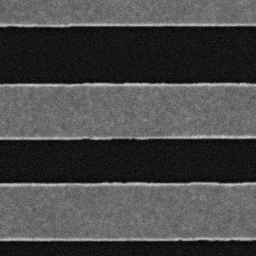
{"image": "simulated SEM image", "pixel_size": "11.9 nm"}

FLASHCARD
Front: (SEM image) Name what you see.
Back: lines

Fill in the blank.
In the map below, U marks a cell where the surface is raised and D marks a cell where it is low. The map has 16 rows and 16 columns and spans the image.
UUUUUUUUUUUUUUUU
UUUUUUUUUUUUUUUU
DDDDDDDDDDDDDDDD
DDDDDDDDDDDDDDDD
DDDDDDDDDDDDDDDD
UUUUUUUUUUUUUUUU
UUUUUUUUUUUUUUUU
UUUUUUUUUUUUUUUU
UUUUUUUUUUUUUUUU
DDDDDDDDDDDDDDDD
DDDDDDDDDDDDDDDD
DDDDDDDDDDDDUDDD
UUUUUUUUUUUUUUUU
UUUUUUUUUUUUUUUU
UUUUUUUUUUUUUUUU
DDDDDDDDDDDDDDDD